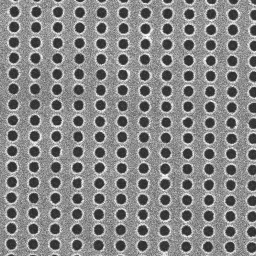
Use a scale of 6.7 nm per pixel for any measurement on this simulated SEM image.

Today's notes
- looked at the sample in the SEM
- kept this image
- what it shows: a regular array of holes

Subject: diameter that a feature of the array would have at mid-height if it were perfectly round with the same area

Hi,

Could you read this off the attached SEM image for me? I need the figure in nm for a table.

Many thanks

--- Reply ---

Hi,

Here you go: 70.1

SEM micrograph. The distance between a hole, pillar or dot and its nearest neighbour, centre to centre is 15.4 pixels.